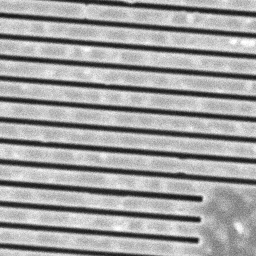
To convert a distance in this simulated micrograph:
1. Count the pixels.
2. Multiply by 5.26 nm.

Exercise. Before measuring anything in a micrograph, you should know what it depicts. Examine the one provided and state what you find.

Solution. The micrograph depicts parallel lines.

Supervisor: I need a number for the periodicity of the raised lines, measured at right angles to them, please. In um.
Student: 0.11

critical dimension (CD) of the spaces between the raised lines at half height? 32.8 nm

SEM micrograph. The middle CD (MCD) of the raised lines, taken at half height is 75.4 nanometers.